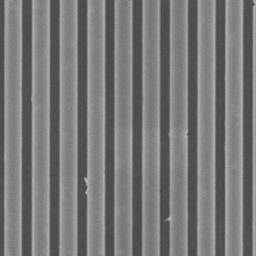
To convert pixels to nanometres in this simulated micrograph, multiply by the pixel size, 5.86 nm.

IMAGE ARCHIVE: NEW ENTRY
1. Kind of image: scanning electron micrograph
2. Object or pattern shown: parallel lines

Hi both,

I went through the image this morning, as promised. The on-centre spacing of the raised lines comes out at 162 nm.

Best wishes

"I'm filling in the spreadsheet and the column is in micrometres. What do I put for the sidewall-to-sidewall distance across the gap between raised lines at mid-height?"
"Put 0.0564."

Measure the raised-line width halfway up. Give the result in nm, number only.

102